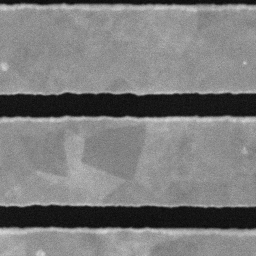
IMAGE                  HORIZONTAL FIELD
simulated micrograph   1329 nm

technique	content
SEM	lines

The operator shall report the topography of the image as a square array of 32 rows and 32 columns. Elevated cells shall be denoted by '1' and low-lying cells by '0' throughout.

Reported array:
00000000000000000000000000000000
11111111111111111111111111111111
11111111111111111111111111111111
11111111111111111111111111111111
11111111111111111111111111111111
11111111111111111111111111111111
11111111111111111111111111111111
11111111111111111111111111111111
11111111111111111111111111111111
11111111111111111111111111111111
11111111111111111111111111111111
11111111111111111111111111111111
00000000000000000000000000000000
00000000000000000000000000000000
00000000000000000000000000000000
11111111111111111111111111111111
11111111111111111111111111111111
11111111111111111111111111111111
11111111111111111111111111111111
11111111111111111111111111111111
11111111111111111111111111111111
11111111111111111111111111111111
11111111111111111111111111111111
11111111111111111111111111111111
11111111111111111111111111111111
11111111111111111111111111111111
00000000000000000000000000000000
00000000000000000000000000000000
00001111000000000010000000000000
11111111111111111111111111111111
11111111111111111111111111111111
11111111111111111111111111111111